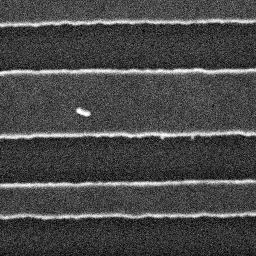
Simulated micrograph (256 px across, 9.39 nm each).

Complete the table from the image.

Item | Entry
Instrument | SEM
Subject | lines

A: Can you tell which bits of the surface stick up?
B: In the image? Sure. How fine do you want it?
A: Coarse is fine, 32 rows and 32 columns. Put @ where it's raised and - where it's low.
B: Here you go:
@@@@@@@@@@@@@@@@@@@@@@@@@@@@@@@@
@@@@@@@@@@@@@@@@@@@@@@@@@@@@@@@@
@@@@@@@@@@@@@@@@@@@@@@@@@@@@@@@@
--------------------------------
--------------------------------
--------------------------------
--------------------------------
--------------------------------
--------------------------------
@@@@@@@@@@@@@@@@@@@@@@@@@@@@@@@@
@@@@@@@@@@@@@@@@@@@@@@@@@@@@@@@@
@@@@@@@@@@@@@@@@@@@@@@@@@@@@@@@@
@@@@@@@@@@@@@@@@@@@@@@@@@@@@@@@@
@@@@@@@@@@@@@@@@@@@@@@@@@@@@@@@@
@@@@@@@@@@@@@@@@@@@@@@@@@@@@@@@@
@@@@@@@@@@@@@@@@@@@@@@@@@@@@@@@@
@@@@@@@@@@@@@@@@@@@@@@@@@@@@@@@@
--------------------------------
--------------------------------
--------------------------------
--------------------------------
--------------------------------
--------------------------------
@@@@@@@@@@@@@@@@@@@@@@@@@@@@@@@@
@@@@@@@@@@@@@@@@@@@@@@@@@@@@@@@@
@@@@@@@@@@@@@@@@@@@@@@@@@@@@@@@@
@@@@@@@@@@@@@@@@@@@@@@@@@@@@@@@@
--------------------------------
--------------------------------
--------------------------------
--------------------------------
--------------------------------